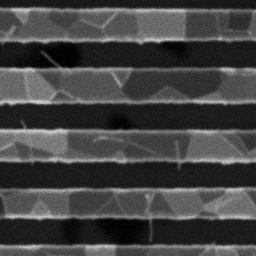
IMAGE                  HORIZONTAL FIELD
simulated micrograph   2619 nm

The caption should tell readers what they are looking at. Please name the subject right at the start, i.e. lines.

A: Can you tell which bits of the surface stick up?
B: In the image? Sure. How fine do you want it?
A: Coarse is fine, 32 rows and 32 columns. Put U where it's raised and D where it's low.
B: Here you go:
DDDDDDDDDDDDDDDDDDDDDDDDDDDDDDDD
UUUUUUUUUUUUUUUUUUUUUUUUUUUUUUUU
UUUUUUUUUUUUUUUUUUUUUUUUUUUUUUUU
UUUUUUUUUUUUUUUUUUUUUUUUUUUUUUUU
UUUUUUUUUUUUUUUUUUUUUUUUUUUUUUUU
DDDDDDDDDDDDDDDDDDDDDDDDDDDDDDDD
DDDDDDDDDDDDDDDDDDDDDDDDDDDDDDDD
DDDDDDDDDDDDDDDDDDDDDDDDDDDDDDDD
DDDDDDDDDDDDDDDDDDDDDDDDDDDDDDDD
UUUUUUUUUUUUUUUUUUUUUUUUUUUUUUUU
UUUUUUUUUUUUUUUUUUUUUUUUUUUUUUUU
UUUUUUUUUUUUUUUUUUUUUUUUUUUUUUUU
UUUUUUUUUUUUUUUUUUUUUUUUUUUUUUUU
DDDDDDDDDDDDDDDDDDDDDDDDDDDDDDDD
DDDDDDDDDDDDDDDDDDDDDDDDDDDDDDDD
DDDDDDDDDDDDDDDDDDDDDDDDDDDDDDDD
UUUUUUUUUUUUUUUUUUUUUUUUUUUUUUUU
UUUUUUUUUUUUUUUUUUUUUUUUUUUUUUUU
UUUUUUUUUUUUUUUUUUUUUUUUUUUUUUUU
UUUUUUUUUUUUUUUUUUUUUUUUUUUUUUUU
DDDDDDDDDDDDDDDDDDDDDDDDDDDDDDDD
DDDDDDDDDDDDDDDDDDDDDDDDDDDDDDDD
DDDDDDDDDDDDDDDDDDDDDDDDDDDDDDDD
DDDDDDDDDDDDDDDDDDDDDDDDDDDDDDDD
UUUUUUUUUUUUUUUUUUUUUUUUUUUUUUUU
UUUUUUUUUUUUUUUUUUUUUUUUUUUUUUUU
UUUUUUUUUUUUUUUUUUUUUUUUUUUUUUUU
DDDDDDDDDDDDDDDDDDDDDDDDDDDDDDDD
DDDDDDDDDDDDDDDDDDDDDDDDDDDDDDDD
DDDDDDDDDDDDDDDDDDDDDDDDDDDDDDDD
DDDDDDDDDDDDDDDDDDDDDDDDDDDDDDDD
UUUUUUUUUUUUUUUUUUUUUUUUUUUUUUUU